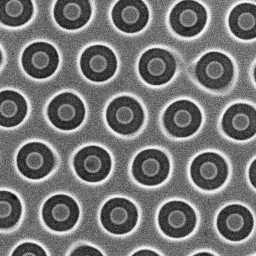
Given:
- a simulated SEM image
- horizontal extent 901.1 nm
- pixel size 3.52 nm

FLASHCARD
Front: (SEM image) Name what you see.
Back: an array of small figures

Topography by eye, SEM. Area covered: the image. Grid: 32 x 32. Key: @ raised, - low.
----@@@----@@@----@@@@---@@@@@--
----@@@-----@@-----@@-----@@@---
----@@@----@@@-----@@-----@@----
@@@@@@@@--@@@@@---@@@-----@@@---
@@@@@@@@@@@@@@@@@@@@@@--@@@@@---
@@@@--@@@@@@@@@@@@@@@@@@@@@@@@@@
@@@----@@@----@@@@----@@@@-@@@@@
@@@----@@@-----@@-----@@@----@@@
@@@----@@@-----@@-----@@-----@@@
@@@@--@@@@@---@@@@----@@-----@@@
@@@@@@@@@@@@@@@@@@@--@@@@----@@@
--@@@@@@-@@@@@@@@@@@@@@@@@@@@@@@
---@@@----@@@@---@@@@@--@@@@@@@@
----@@-----@@-----@@@----@@@----
---@@@-----@@-----@@-----@@@----
--@@@@----@@@-----@@-----@@@----
@@@@@@@@@@@@@@---@@@@---@@@@----
@@@@@@@@@@@@@@@@@@@@@@@@@@@@@--@
@@@---@@@@---@@@@@@@@@@@@@@@@@@@
@@-----@@-----@@@----@@@@---@@@@
@@-----@@-----@@-----@@@-----@@-
@@@---@@@-----@@-----@@@-----@@-
@@@@-@@@@@---@@@@----@@@----@@@-
@@@@@@@@@@@@@@@@@@@@@@@@@--@@@@@
--@@@@@--@@@@@@@@@@@@@@@@@@@@@@@
---@@-----@@@----@@@----@@@@@-@@
---@@-----@@@----@@@----@@@----@
---@@-----@@@----@@@-----@@-----
--@@@@---@@@@----@@@----@@@-----
@@@@@@@@@@@@@@@@@@@@@--@@@@@---@
@@@--@@@@@-@@@@@@@@@@@@@@@@@@@@@
@@----@@@----@@@@---@@@@@-@@@@@@